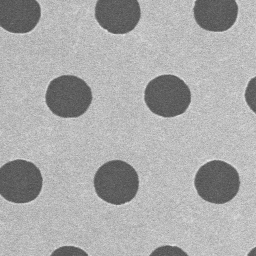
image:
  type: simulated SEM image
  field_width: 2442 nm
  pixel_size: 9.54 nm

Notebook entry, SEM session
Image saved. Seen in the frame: holes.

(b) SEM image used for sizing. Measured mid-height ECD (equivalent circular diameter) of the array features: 45.1 pixels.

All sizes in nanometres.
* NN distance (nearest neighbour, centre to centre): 942